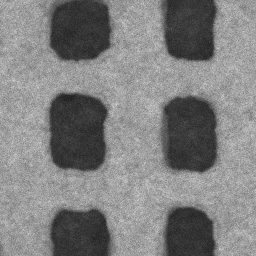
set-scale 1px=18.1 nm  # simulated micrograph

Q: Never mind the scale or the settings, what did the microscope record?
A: holes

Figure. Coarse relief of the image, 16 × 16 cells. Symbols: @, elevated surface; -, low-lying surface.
@@@----@@@---@@@
@@@----@@@---@@@
@@@----@@@---@@@
@@@@--@@@@@--@@@
@@@@@@@@@@@@@@@@
@@@@@@@@@@@@@@@@
@@@---@@@@---@@@
@@@----@@@----@@
@@@----@@@----@@
@@@----@@@----@@
@@@@--@@@@@--@@@
@@@@@@@@@@@@@@@@
@@@@@@@@@@@@@@@@
@@@@--@@@@@--@@@
@@@----@@@---@@@
@@@----@@@---@@@